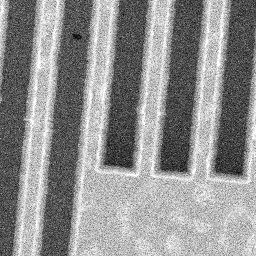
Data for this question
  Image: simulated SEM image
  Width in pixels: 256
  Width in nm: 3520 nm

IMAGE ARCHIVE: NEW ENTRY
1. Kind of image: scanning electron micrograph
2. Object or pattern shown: parallel lines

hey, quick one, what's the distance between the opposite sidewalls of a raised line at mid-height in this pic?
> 286 nm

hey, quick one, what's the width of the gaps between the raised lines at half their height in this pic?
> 469 nanometers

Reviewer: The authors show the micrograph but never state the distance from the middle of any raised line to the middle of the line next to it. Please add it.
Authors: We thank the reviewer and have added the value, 760 nm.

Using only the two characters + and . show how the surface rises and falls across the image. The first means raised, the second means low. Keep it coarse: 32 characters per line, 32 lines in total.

+....+++....++.....+++....++....
+....+++....++.....++.....++....
.....++.....++.....++.....++....
.....++.....++.....++.....++....
.....++.....++.....++....+++....
.....++....+++....+++....+++....
....+++....+++....+++....+++....
....+++....+++....+++....+++....
....+++....+++....+++....+++....
....+++....+++....+++....+++....
....+++....+++....+++....++.....
....+++....++.....++.....++.....
....++.....++.....++.....++.....
....++.....++.....++.....++....+
....++.....++.....++....+++....+
....++.....++....+++....+++....+
...+++.....++....+++....+++....+
...+++....+++....+++....+++....+
...+++....+++....+++....+++....+
...+++....+++....+++....+++....+
...+++....+++....+++....++.....+
...+++....++++++++++....++.....+
...+++....++++++++++++++++++++++
...++.....++++++++++++++++++++++
...++.....++++++++++++++++++++++
...++.....++++++++++++++++++++++
...++....+++++++++++++++++++++++
..+++....+++++++++++++++++++++++
..+++....+++++++++++++++++++++++
..+++....+++++++++++++++++++++++
..+++....+++++++++++++++++++++++
..+++....+++++++++++++++++++++++